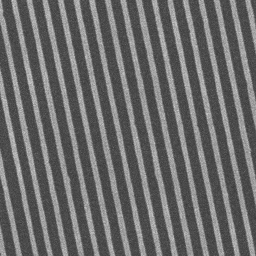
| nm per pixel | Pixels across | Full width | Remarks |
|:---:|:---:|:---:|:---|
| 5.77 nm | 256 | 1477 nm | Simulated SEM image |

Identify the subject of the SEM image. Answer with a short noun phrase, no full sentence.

parallel lines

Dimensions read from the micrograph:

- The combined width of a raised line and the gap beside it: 88 nm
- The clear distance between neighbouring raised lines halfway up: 59.3 nm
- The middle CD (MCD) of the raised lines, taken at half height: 0.0297 microns